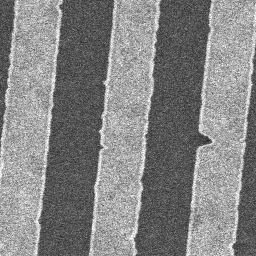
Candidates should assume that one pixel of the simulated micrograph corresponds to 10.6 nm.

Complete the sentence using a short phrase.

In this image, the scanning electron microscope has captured one or a few lines or trenches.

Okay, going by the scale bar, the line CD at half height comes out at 0.464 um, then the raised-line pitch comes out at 97.7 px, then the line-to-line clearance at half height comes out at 54.4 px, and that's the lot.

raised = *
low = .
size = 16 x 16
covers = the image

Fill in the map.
.***...***...***
.***...***...***
.***...***...***
.**....***...***
.**....**....***
.**....**....***
***....**....**.
***...***....**.
***...***....**.
***...***...***.
***...***...***.
***...***...***.
***...***...***.
**....***...***.
**....**....***.
**....**....***.